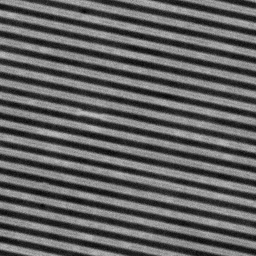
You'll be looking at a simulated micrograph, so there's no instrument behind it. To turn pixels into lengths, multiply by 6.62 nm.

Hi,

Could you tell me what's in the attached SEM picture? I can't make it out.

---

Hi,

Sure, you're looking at parallel lines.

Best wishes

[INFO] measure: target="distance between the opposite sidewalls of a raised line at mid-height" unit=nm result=37.3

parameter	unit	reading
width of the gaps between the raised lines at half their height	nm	49.4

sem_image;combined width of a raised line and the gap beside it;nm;88.7